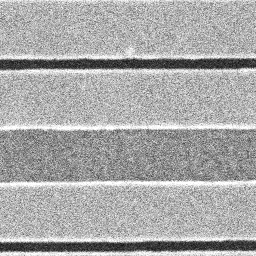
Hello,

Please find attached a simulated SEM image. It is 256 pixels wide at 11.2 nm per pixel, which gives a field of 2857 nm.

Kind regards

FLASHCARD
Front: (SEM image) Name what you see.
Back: lines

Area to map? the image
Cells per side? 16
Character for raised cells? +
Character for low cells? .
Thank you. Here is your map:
++++++++++++++++
++++++++++++++++
++++++++++++++++
++++++++++++++++
++++++++++++++++
++++++++++++++++
++++++++++++++++
++++++++++++++++
................
................
................
++++++++++++++++
++++++++++++++++
++++++++++++++++
++++++++++++++++
................